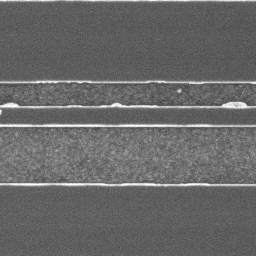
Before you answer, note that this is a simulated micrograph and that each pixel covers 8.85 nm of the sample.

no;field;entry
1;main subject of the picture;lines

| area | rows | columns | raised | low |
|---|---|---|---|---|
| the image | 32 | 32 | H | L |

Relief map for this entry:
HHHHHHHHHHHHHHHHHHHHHHHHHHHHHHHH
HHHHHHHHHHHHHHHHHHHHHHHHHHHHHHHH
HHHHHHHHHHHHHHHHHHHHHHHHHHHHHHHH
HHHHHHHHHHHHHHHHHHHHHHHHHHHHHHHH
HHHHHHHHHHHHHHHHHHHHHHHHHHHHHHHH
HHHHHHHHHHHHHHHHHHHHHHHHHHHHHHHH
HHHHHHHHHHHHHHHHHHHHHHHHHHHHHHHH
HHHHHHHHHHHHHHHHHHHHHHHHHHHHHHHH
HHHHHHHHHHHHHHHHHHHHHHHHHHHHHHHH
HHHHHHHHHHHHHHHHHHHHHHHHHHHHHHHH
LLLLLLLLLLLLLLLLLLLLLLLLLLLLLLLL
LLLLLLLLLLLLLLLLLLLLLLLLLLLLLLLL
LLLLLLLLLLLLLLLLLLLLLLLLLLLLLLLL
HHHHHHHHHHHHHHHHHHHHHHHHHHHHHHHH
HHHHHHHHHHHHHHHHHHHHHHHHHHHHHHHH
HHHHHHHHHHHHHHHHHHHHHHHHHHHHHHHH
LLLLLLLLLLLLLLLLLLLLLLLLLLLLLLLL
LLLLLLLLLLLLLLLLLLLLLLLLLLLLLLLL
LLLLLLLLLLLLLLLLLLLLLLLLLLLLLLLL
LLLLLLLLLLLLLLLLLLLLLLLLLLLLLLLL
LLLLLLLLLLLLLLLLLLLLLLLLLLLLLLLL
LLLLLLLLLLLLLLLLLLLLLLLLLLLLLLLL
LLLLLLLLLLLLLLLLLLLLLLLLLLLLLLLL
HHHHHHHHHHHHHHHHHHHHHHHHHHHHHHHH
HHHHHHHHHHHHHHHHHHHHHHHHHHHHHHHH
HHHHHHHHHHHHHHHHHHHHHHHHHHHHHHHH
HHHHHHHHHHHHHHHHHHHHHHHHHHHHHHHH
HHHHHHHHHHHHHHHHHHHHHHHHHHHHHHHH
HHHHHHHHHHHHHHHHHHHHHHHHHHHHHHHH
HHHHHHHHHHHHHHHHHHHHHHHHHHHHHHHH
HHHHHHHHHHHHHHHHHHHHHHHHHHHHHHHH
HHHHHHHHHHHHHHHHHHHHHHHHHHHHHHHH